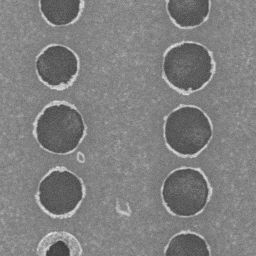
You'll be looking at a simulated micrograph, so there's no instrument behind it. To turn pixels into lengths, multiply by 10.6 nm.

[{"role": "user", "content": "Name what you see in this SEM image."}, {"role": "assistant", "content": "holes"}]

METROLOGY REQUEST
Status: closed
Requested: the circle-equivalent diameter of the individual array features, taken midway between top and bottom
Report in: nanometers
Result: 507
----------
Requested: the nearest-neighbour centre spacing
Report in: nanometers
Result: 676